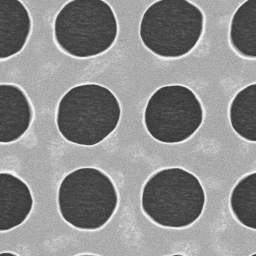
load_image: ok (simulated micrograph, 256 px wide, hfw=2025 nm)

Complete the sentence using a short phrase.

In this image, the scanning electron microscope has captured holes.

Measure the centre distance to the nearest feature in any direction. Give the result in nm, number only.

665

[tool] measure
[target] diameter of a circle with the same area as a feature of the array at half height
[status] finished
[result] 0.48 um